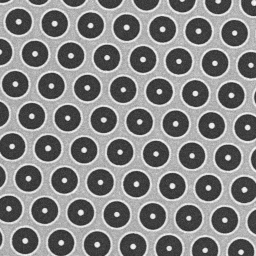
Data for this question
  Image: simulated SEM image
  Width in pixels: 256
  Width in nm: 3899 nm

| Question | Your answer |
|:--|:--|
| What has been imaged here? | an array of small figures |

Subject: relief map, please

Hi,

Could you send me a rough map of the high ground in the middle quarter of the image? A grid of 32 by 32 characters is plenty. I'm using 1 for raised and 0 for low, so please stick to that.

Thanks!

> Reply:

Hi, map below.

00001111000000111000000110000000
11111111100001111000001111000001
11111111111111111111111111100011
11110000111110000111111011111111
11100000011100000011100000111110
01000000011000000011100000011100
11000000011000000011000000011000
11100000011000000011000000011000
11110000111100000011100000011100
11111101111110000111110000111100
00011111111111111111111111111110
00001111000011111000011111101111
00001110000001110000001110000011
00000100000001110000001110000001
00001110000001100000001100000001
00001110000001110000001100000001
00011110000011110000001110000001
11111111101111111000011111000011
11100001111111011111111111111111
11000000111100001111100001111111
11000000111000000111000000111100
10000000011000000111000000111000
11000000111000000011000000011000
11000000111000000111000000110000
11100001111000000111000000111000
11111111111110111111100001111100
00111111000111111111111111111111
00011100000011110000011110000111
00001100000011100000011100000011
00001100000001100000001100000011
00011100000011100000001100000001
00011100000011100000011100000001